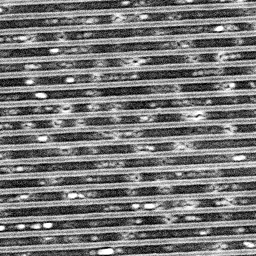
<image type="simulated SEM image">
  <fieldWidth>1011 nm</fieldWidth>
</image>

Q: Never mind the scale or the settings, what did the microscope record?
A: parallel lines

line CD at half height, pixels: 4.51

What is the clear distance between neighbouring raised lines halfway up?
38.5 nm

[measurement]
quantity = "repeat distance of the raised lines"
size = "0.0573 um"